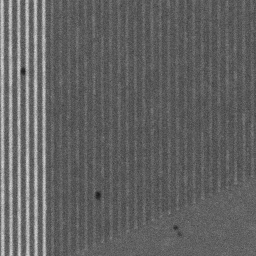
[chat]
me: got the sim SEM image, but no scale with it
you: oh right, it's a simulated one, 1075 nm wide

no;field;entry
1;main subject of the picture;parallel lines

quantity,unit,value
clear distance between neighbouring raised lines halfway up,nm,25.7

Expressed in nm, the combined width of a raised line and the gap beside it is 34.9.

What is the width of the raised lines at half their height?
0.0084 um